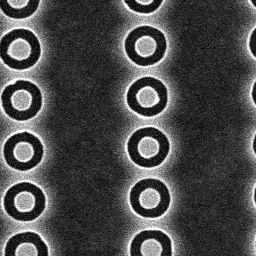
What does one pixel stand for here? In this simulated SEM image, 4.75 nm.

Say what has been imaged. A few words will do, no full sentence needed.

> ring-shaped grooves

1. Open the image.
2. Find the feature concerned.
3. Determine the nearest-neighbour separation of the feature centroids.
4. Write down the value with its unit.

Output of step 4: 240 nanometres